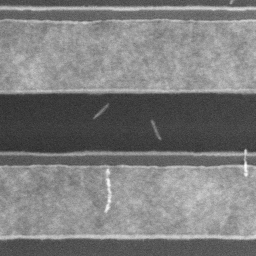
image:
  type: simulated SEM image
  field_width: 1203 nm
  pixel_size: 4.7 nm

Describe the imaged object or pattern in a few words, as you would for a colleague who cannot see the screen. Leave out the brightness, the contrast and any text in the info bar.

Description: lines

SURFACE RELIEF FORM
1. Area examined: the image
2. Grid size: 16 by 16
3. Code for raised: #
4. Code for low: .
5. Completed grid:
................
################
################
################
################
################
................
................
................
................
################
################
################
################
################
................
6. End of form